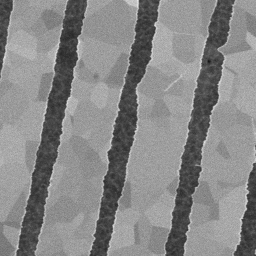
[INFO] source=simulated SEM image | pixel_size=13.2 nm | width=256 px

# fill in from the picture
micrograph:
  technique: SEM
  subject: one or a few lines or trenches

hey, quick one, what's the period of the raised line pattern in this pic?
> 0.939 micrometres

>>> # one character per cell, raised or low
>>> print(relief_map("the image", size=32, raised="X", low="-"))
--XXXXXXX--XXXXXX---XXXXXXX--XXX
-XXXXXXX---XXXXXX---XXXXXXX--XXX
-XXXXXXXX-XXXXXXX---XXXXXX---XXX
-XXXXXXXX-XXXXXXX---XXXXXX---XXX
-XXXXXXXX-XXXXXXX--XXXXXXX---XXX
-XXXXXX---XXXXXXX--XXXXXXX--XXXX
-XXXXXX---XXXXXX---XXXXXX---XXXX
-XXXXXX---XXXXXX---XXXXXX---XXXX
XXXXXXX--XXXXXXX--XXXXXXX---XXXX
XXXXXXX--XXXXXXX--XXXXXXX---XXXX
XXXXXXX--XXXXXX--XXXXXXXX--XXXXX
XXXXXX---XXXXXX--XXXXXXX---XXXXX
XXXXXX---XXXXXX--XXXXXXX---XXXXX
XXXXXX--XXXXXXX--XXXXXXX---XXXXX
XXXXXX--XXXXXXX--XXXXXXXX-XXXXXX
XXXXX---XXXXXX---XXXXXXX--XXXXXX
XXXXX---XXXXXX---XXXXXX---XXXXXX
XXXXX---XXXXXX---XXXXXX---XXXXXX
XXXXX--XXXXXXX--XXXXXXX--XXXXXXX
XXXXX--XXXXXX---XXXXXXX--XXXXXXX
XXXX---XXXXXXX--XXXXXXX--XXXXXXX
XXXX---XXXXXX---XXXXXX---XXXXXX-
XXXX--XXXXXXX---XXXXXX---XXXXXX-
XXXX--XXXXXXX--XXXXXXX---XXXXXX-
XXXX--XXXXXXXX-XXXXXXX--XXXXXXX-
XXX---XXXXXXX--XXXXXXX--XXXXXXX-
XXX---XXXXXX---XXXXXX---XXXXXXX-
XXX---XXXXXX--XXXXXXX---XXXXXX--
XXX--XXXXXXX--XXXXXXX---XXXXXX--
XX---XXXXXXX--XXXXXXX--XXXXXXX--
XX---XXXXXXX--XXXXXXX--XXXXXXX--
XX--XXXXXXX---XXXXXXX--XXXXXX---